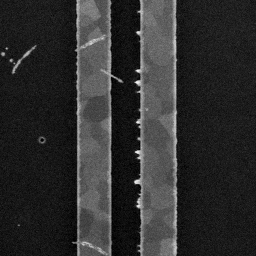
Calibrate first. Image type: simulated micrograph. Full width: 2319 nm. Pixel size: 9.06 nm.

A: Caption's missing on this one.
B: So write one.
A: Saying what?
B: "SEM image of lines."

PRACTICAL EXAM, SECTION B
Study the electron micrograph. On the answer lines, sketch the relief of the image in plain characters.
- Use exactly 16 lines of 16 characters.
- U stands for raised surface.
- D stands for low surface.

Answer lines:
DDDDDUUDDUUDDDDD
DDDDDUUDDUUDDDDD
DDDDDUUDDUUDDDDD
DDDDDUUDDUUDDDDD
DDDDDUUDDUUDDDDD
DDDDDUUDDUUDDDDD
DDDDDUUDDUUDDDDD
DDDDDUUDDUUDDDDD
DDDDDUUDDUUDDDDD
DDDDDUUDDUUDDDDD
DDDDDUUDDUUDDDDD
DDDDDUUDDUUDDDDD
DDDDDUUDDUUDDDDD
DDDDDUUDDUUDDDDD
DDDDDUUDDUUDDDDD
DDDDDUUDDUUDDDDD